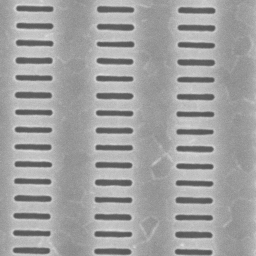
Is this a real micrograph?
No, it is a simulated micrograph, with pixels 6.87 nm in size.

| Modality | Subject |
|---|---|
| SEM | a regular array of holes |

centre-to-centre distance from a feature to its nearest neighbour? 117 nanometres